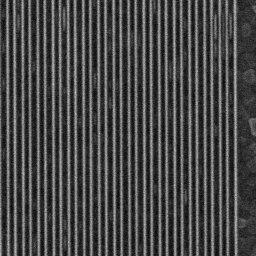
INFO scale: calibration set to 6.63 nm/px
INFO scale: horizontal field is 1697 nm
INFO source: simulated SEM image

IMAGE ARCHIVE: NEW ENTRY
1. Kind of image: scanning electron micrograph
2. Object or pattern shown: parallel lines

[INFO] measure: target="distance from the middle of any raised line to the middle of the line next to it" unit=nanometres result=50.3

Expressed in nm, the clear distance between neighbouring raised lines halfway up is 38.9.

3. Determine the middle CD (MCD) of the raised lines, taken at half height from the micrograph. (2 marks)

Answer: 11.6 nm